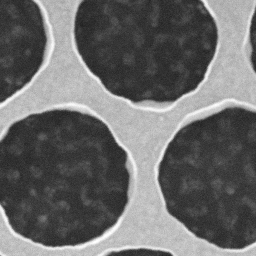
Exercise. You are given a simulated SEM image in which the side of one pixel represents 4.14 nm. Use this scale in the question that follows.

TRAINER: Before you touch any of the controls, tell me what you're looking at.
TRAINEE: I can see holes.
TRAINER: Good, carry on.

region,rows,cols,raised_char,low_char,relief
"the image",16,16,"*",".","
..***........***
...**.........**
...**.........*.
...**........**.
..****.......***
.******.....****
*********..*****
*.....******....
.......****.....
........**......
........**......
........**......
........**......
........***.....
*......*****....
**************.*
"